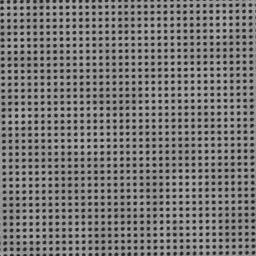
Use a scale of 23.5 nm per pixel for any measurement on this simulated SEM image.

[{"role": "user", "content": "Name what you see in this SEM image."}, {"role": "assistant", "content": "a regular array of holes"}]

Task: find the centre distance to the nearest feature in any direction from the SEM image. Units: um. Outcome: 0.145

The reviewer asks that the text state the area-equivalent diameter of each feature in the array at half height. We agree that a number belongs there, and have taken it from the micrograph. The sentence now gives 95.7 nanometers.